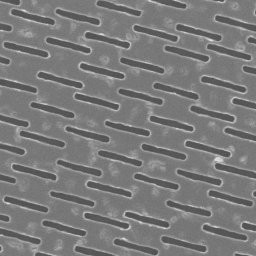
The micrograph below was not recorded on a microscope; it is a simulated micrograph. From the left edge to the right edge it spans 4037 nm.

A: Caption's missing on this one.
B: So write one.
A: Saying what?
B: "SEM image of a regular array of holes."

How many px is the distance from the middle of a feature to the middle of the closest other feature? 31.1